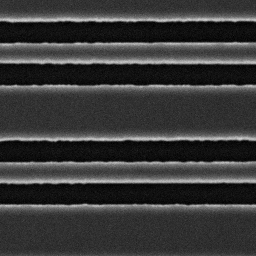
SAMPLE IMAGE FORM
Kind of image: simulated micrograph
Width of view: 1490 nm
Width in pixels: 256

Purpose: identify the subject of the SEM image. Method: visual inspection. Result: lines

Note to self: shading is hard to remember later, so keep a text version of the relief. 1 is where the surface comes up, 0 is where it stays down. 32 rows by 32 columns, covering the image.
11111111111111111111111111111111
11111111111111111111111111111111
11111111111111111111111111111111
00000000000000000000000000000000
00000000000000000000000000000000
00110100011011111101111111111111
11111111111111111111111111111111
11111111111111111111111111111111
00000000000000000000000000000000
00000000000000000000000000000000
00000000000000000000000000000000
11111111111111111111111111111111
11111111111111111111111111111111
11111111111111111111111111111111
11111111111111111111111111111111
11111111111111111111111111111111
11111111111111111111111111111111
10111011110111110111110001000001
00000000000000000000000000000000
00000000000000000000000000000000
11111111111111111111111111111111
11111111111111111111111111111111
11111111111111111111111111111111
00000000000000000000000000000000
00000000000000000000000000000000
00000000000000000000000000000000
11111111111111111111111111111111
11111111111111111111111111111111
11111111111111111111111111111111
11111111111111111111111111111111
11111111111111111111111111111111
11111111111111111111111111111111